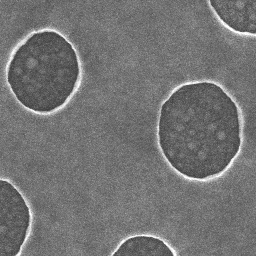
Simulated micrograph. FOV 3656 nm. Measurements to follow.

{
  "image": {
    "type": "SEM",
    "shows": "holes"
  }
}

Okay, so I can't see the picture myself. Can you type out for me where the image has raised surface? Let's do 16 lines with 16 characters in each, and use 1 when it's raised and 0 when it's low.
1111111111111000
1111111111111100
1100111111111111
1000011111111111
0000011111111111
1000011111100011
1000111111000001
1111111111000001
1111111111000001
1111111111000001
1111111111100011
0111111111111111
0111111111111111
0011111111111111
0011111111111111
0111111000011111